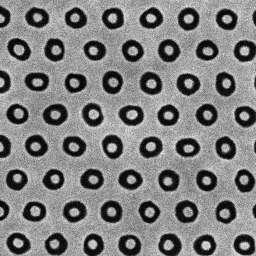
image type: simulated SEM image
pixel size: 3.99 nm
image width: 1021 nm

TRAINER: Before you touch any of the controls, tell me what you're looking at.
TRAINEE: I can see a regular array of ring-shaped grooves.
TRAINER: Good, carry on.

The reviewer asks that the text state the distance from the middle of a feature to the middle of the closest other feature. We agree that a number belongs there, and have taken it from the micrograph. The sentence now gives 145 nm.